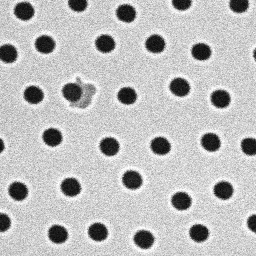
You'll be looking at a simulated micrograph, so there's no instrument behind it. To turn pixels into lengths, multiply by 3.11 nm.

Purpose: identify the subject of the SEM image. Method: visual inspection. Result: a regular array of holes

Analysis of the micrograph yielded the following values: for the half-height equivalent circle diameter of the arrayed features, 63 nm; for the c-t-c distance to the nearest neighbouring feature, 127 nanometres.